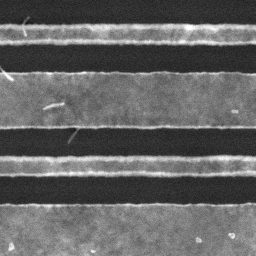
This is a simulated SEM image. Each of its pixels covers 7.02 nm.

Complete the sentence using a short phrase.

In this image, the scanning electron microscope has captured lines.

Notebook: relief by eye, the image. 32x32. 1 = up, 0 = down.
00000000000000000000000000000000
00000000000000000000000000000000
00000000000000000000000000000000
11111111111111111111111111111111
11111111111111111111111111111111
00000000000000000000000000011000
00000000000000000000000000000000
00000000000000000000000000000000
00000000000000000000000000000000
11111111111111111111111111111111
11111111111111111111111111111111
11111111111111111111111111111111
11111111111111111111111111111111
11111111111111111111111111111111
11111111111111111111111111111111
11111111111111111111111111111111
00000000000000000000000000000000
00000000000000000000000000000000
00000000000000000000000000000000
00000000000000000000000000001000
11111111111111111111111111111111
11111111111111111111111111111111
00000000000000000000000000000000
00000000000000000000000000000000
00000000000000000000000000000000
00000000000000000001000000000001
11111111111111111111111111111111
11111111111111111111111111111111
11111111111111111111111111111111
11111111111111111111111111111111
11111111111111111111111111111111
11111111111111111111111111111111